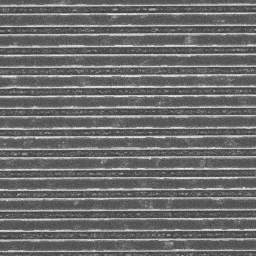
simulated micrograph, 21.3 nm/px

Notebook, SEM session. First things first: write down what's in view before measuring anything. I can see parallel lines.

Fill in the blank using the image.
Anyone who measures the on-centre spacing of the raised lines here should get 0.438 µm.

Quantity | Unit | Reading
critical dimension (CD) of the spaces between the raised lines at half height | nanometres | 163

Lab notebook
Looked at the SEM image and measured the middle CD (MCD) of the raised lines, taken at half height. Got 264 nm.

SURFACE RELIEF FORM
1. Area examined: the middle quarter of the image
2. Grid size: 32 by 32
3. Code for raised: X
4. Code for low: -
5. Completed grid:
XXXXXXXXXXXXXXXXXXXXXXXXXXXXXXXX
--------------------------------
--------------------------------
XXXXXXXXXXXXXXXXXXXXXXXXXXXXXXXX
XXXXXXXXXXXXXXXXXXXXXXXXXXXXXXXX
XXXXXXXXXXXXXXXXXXXXXXXXXXXXXXXX
--------------------------------
--------------------------------
XXXXXXXXXXXXXXXXXXXXXXXXXXXXXXXX
XXXXXXXXXXXXXXXXXXXXXXXXXXXXXXXX
XXXXXXXXXXXXXXXXXXXXXXXXXXXXXXXX
--------------------------------
--------------------------------
XXXXXXXXXXXXXXXXXXXXXXXXXXXXXXXX
XXXXXXXXXXXXXXXXXXXXXXXXXXXXXXXX
XXXXXXXXXXXXXXXXXXXXXXXXXXXXXXXX
--------------------------------
--------------------------------
XXXXXXXXXXXXXXXXXXXXXXXXXXXXXXXX
XXXXXXXXXXXXXXXXXXXXXXXXXXXXXXXX
XXXXXXXXXXXXXXXXXXXXXXXXXXXXXXXX
--------------------------------
--------------------------------
XXXXXXXXXXXXXXXXXXXXXXXXXXXXXXXX
XXXXXXXXXXXXXXXXXXXXXXXXXXXXXXXX
XXXXXXXXXXXXXXXXXXXXXXXXXXXXXXXX
--------------------------------
--------------------------------
--------------------------------
XXXXXXXXXXXXXXXXXXXXXXXXXXXXXXXX
XXXXXXXXXXXXXXXXXXXXXXXXXXXXXXXX
XXXXXXXXXXX---------------------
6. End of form